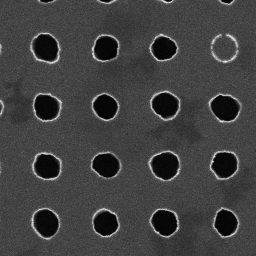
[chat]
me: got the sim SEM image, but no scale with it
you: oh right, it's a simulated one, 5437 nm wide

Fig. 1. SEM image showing a regular array of holes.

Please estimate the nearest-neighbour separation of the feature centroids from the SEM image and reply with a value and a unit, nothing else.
1.21 um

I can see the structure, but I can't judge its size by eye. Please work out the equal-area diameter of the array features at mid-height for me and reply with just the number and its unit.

527 nanometres